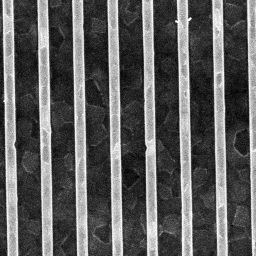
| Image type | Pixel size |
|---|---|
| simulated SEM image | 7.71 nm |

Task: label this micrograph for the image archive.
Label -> parallel lines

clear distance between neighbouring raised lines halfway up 0.193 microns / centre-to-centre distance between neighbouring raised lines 269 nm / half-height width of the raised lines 76.1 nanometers